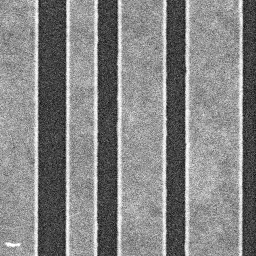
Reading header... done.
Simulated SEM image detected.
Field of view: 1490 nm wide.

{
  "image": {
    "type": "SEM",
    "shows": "one or a few lines or trenches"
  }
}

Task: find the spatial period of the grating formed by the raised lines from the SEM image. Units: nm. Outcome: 385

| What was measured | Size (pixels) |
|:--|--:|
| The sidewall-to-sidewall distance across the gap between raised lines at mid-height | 23.3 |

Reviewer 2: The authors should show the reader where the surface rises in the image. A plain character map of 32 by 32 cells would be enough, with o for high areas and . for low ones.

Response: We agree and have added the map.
ooooo....ooo...oooooo..ooooooo..
ooooo....ooo...oooooo..ooooooo..
ooooo....ooo...oooooo..ooooooo..
ooooo....ooo...oooooo..ooooooo..
ooooo....ooo...oooooo..ooooooo..
ooooo....ooo...oooooo..ooooooo..
ooooo....ooo...oooooo..ooooooo..
ooooo....ooo...oooooo..ooooooo..
ooooo....ooo...oooooo..ooooooo..
ooooo....ooo...oooooo..ooooooo..
ooooo....ooo...oooooo..ooooooo..
ooooo...oooo...oooooo..ooooooo..
ooooo...oooo...oooooo..ooooooo..
ooooo...oooo...oooooo..ooooooo..
ooooo...oooo...oooooo..ooooooo..
ooooo...oooo...oooooo..ooooooo..
oooo....oooo...oooooo..ooooooo..
oooo....oooo...oooooo..ooooooo..
oooo....oooo...ooooo...ooooooo..
ooooo...oooo...ooooo...ooooooo..
ooooo...oooo...ooooo...ooooooo..
oooo....oooo...ooooo...ooooooo..
oooo....oooo...ooooo...ooooooo..
oooo....oooo...oooooo..ooooooo..
oooo....oooo...oooooo..ooooooo..
oooo....oooo...oooooo..ooooooo..
oooo....oooo...ooooo...ooooooo..
oooo....oooo...oooooo..ooooooo..
oooo....oooo...oooooo..ooooooo..
oooo....oooo...oooooo..ooooooo..
oooo....oooo...ooooo...ooooooo..
oooo....oooo...oooooo..ooooooo..